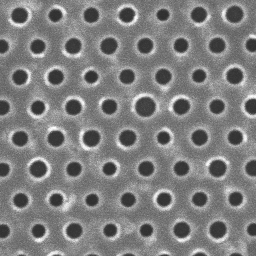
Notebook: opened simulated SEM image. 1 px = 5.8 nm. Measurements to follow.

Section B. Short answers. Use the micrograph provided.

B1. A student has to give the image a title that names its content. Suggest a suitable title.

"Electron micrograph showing a regular array of holes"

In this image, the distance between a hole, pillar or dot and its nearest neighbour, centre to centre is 204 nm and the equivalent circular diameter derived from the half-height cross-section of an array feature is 91.4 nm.